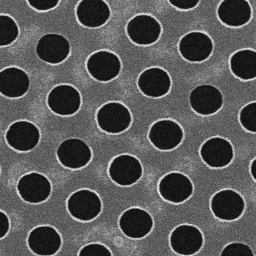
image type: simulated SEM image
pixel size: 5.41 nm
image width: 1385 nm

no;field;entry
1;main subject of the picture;a regular array of holes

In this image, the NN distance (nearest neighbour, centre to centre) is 0.288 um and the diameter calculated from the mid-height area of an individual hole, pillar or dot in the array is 170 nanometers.